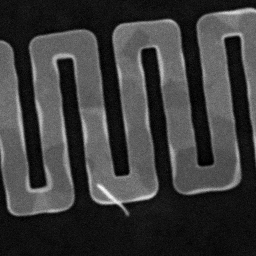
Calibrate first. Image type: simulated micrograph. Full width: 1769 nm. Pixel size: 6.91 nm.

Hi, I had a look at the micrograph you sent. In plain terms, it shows groups of lines, slits or small figures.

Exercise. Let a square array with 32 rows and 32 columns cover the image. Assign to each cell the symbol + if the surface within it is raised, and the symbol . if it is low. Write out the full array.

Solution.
................................
.............................+++
.........................+++++++
...............+++++++...+++++++
.....+++++++..+++++++++..+++..++
+...++++++++..+++++++++..+++..++
++..++++++++..++++..+++..+++..++
++..+++..+++...++...+++..+++..++
++..+++..+++...+++..+++..+++...+
++..+++..++++..+++..+++..+++...+
++..+++...+++..+++..+++..++++..+
++..++++..+++..+++..++++..+++..+
++..++++..+++..+++..++++..+++..+
++...+++..+++..+++...+++..+++..+
++...+++..+++..+++...+++..+++..+
+++..+++..+++...+++..+++..+++..+
+++..+++...++...+++..+++..+++...
+++..+++...+++..+++..+++..++++..
+++..+++...+++..+++..+++...+++..
+++..+++...+++..+++...+++..+++..
+++...++...+++..+++...+++..+++..
+++...+++..+++..+++...++++++++..
+++...+++..+++++++++..++++++++..
.+++..+++..+++++++++..++++++....
.++++++++...+++++++.............
.++++++++.......................
.+++++..........................
................................
................................
................................
................................
................................